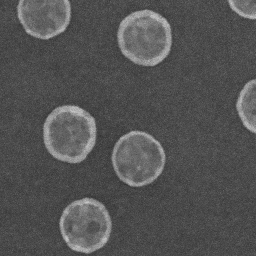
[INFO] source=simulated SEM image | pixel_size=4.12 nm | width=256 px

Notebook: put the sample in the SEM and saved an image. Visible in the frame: raised bodies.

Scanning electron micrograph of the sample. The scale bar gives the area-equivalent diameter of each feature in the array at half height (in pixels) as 50.8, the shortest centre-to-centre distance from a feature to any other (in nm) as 325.